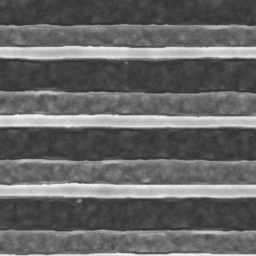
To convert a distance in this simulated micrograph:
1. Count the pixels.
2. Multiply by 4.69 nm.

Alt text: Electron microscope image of lines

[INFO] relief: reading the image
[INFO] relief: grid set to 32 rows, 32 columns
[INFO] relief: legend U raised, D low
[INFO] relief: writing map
DDDDDDDDDDDDDDDDDDDDDDDDDDDDDDDD
DDDDDDDDDDDDDDDDDDDDDDDDDDDDDDDD
DDDDDDDDDDDDDDDDDDDDDDDDDDDDDDDD
UUUUUUUUUUUUUUUUUUUUUUUUUUUUUUUU
UUUUUUUUUUUUUUUUUUUUUUUUUUUUUUUU
UUUUUUUUUUUUUUUUUUUUUUUUUUUUUUUU
UUUUUUUUUUUUUUUUUUUUUUUUUUUUUUUU
DDDDDDDDDDDDDDDDDDDDDDDDDDDDDDDD
DDDDDDDDDDDDDDDDDDDDDDDDDDDDDDDD
DDDDDDDDDDDDDDDDDDDDDDDDDDDDDDDD
DDDDDDDDDDDDDDDDDDDDDDDDDDDDDDDD
UDDUUUUDDDDDDDDDDDDDDDDDDDDDDDDD
UUUUUUUUUUUUUUUUUUUUUUUUUUUUUUUU
UUUUUUUUUUUUUUUUUUUUUUUUUUUUUUUU
UUUUUUUUUUUUUUUUUUUUUUUUUUUUUUUU
UUUUUUUUUUUUUUUUUUUUUUUUUUUUUUUU
DDDDDDDDDDDDDDDDDDDDDDDDDDDDDDDD
DDDDDDDDDDDDDDDDDDDDDDDDDDDDDDDD
DDDDDDDDDDDDDDDDDDDDDDDDDDDDDDDD
DDDDDDDDDDDDDDDDDDDDDDDDDDDDDDDD
UUUUUUUUUUUUUUUUUUUUUUUUUUUUUUUU
UUUUUUUUUUUUUUUUUUUUUUUUUUUUUUUU
UUUUUUUUUUUUUUUUUUUUUUUUUUUUUUUU
UUUUUUUUUUUUUUUUUUUUUUUUUUUUUUUU
UDDDDDUUUUUUUUUUUUUUUUUUUUUUUUUU
DDDDDDDDDDDDDDDDDDDDDDDDDDDDDDDD
DDDDDDDDDDDDDDDDDDDDDDDDDDDDDDDD
DDDDDDDDDDDDDDDDDDDDDDDDDDDDDDDD
DDDDDDDDDDDDDDDDDDDDDDDDDDDDDDDD
UUUUUUUUUUUUUUUUUUUUUUUUUUUUUUUU
UUUUUUUUUUUUUUUUUUUUUUUUUUUUUUUU
UUUUUUUUUUUUUUUUUUUUUUUUUUUUUUUU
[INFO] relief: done